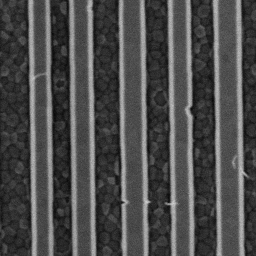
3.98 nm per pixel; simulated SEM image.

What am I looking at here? parallel lines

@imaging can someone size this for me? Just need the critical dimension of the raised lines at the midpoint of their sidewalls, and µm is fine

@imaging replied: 0.0781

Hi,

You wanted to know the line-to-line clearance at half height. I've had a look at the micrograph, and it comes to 0.106 µm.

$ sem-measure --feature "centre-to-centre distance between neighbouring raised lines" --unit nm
187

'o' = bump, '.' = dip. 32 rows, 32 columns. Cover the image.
....oo...oo....ooo...ooo...ooo..
....oo...oo....ooo...ooo...ooo..
....oo...oo....ooo...ooo...ooo..
....oo...oo....ooo...ooo...ooo..
....oo...oo....ooo...ooo...ooo..
....oo...oo....ooo...ooo...ooo..
....oo...oo....ooo...ooo...ooo..
....oo...oo....ooo...ooo...ooo..
....oo...oo....ooo...ooo...ooo..
....oo...oo....ooo...ooo...ooo..
....oo...oo....ooo...ooo...ooo..
....oo...oo....ooo...ooo...ooo..
....oo...oo....ooo...ooo...ooo..
....oo...ooo...ooo...ooo...ooo..
....oo...oo....ooo...ooo...ooo..
....oo...oo....ooo...ooo...ooo..
....oo...oo....ooo...ooo...ooo..
....oo...oo....ooo....oo...ooo..
....oo...ooo...ooo....oo...ooo..
....oo...ooo...ooo....oo...ooo..
....oo...ooo...ooo....oo...ooo..
....oo...ooo...ooo....oo...ooo..
....oo...ooo...ooo....oo...ooo..
....oo...ooo...ooo....oo...ooo..
....oo...ooo...ooo....oo...ooo..
....oo...ooo....oo....oo...ooo..
....oo...ooo....oo....oo...ooo..
....oo...ooo....oo....oo...ooo..
....oo...ooo....oo....oo...ooo..
....oo...ooo....oo....oo...ooo..
....oo...ooo....oo....oo...ooo..
....oo...ooo....oo....oo...ooo..